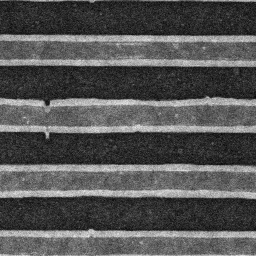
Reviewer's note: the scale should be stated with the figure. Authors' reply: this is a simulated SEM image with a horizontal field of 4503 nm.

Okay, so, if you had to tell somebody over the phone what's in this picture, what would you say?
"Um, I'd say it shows one or a few lines or trenches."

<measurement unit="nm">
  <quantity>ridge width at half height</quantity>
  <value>457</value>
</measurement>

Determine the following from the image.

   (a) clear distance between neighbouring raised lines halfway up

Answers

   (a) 688 nm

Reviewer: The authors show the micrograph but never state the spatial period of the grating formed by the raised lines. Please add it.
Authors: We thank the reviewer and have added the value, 1.15 um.